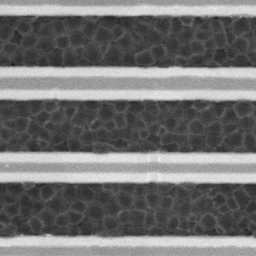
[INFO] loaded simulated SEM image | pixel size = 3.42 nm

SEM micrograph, one or a few lines or trenches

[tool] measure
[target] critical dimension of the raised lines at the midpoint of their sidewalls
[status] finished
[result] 74 nm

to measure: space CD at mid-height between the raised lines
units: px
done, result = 62.9